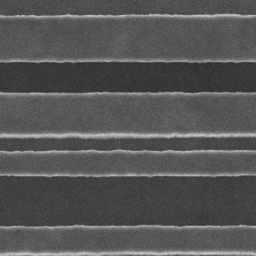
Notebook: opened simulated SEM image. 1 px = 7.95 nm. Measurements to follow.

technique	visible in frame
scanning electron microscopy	lines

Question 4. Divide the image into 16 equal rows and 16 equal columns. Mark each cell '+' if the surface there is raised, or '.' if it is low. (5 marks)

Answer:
++++++++++++++++
++++++++++++++++
++++++++++++++++
++++++++++++++++
................
................
++++++++++++++++
++++++++++++++++
++++++++++++++++
++++++++++++++++
++++++++++++++++
................
................
................
++++++++++++++++
++++++++++++++++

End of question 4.